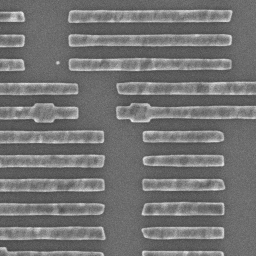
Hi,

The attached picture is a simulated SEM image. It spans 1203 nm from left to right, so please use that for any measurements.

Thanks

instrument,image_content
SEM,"wiring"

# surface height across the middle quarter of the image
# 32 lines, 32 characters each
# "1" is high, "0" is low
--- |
01111111111111111111111111111111
00011110000000011111000000000000
00000000000000000000000000000000
00000000000000000000000000000000
00000000000000000000000000000000
11100000000001111111111111111111
11100000000001111111111111111111
00000000000000000000000000000000
00000000000000000000000000000000
00000000000000000000000000000000
00000000000000001111100000000000
11100000000001111111111111111111
11100000000001111111111111111111
11100000000000111111111111111111
00000000000000000000000000000000
00000000000000000000000000000000
00000000000000000000000000000000
11111111110000000000111111111111
11111111110000000000111111111111
11111111110000000000011111111111
00000000000000000000000000000000
00000000000000000000000000000000
00000000000000000000000000000000
11111111110000000000111111111111
11111111110000000000111111111111
11111111110000000000000000001111
00000000000000000000000000000000
00000000000000000000000000000000
00000000000000000000000000000000
11111111110000000000111111111111
11111111110000000000111111111111
11111111110000000000110011111111